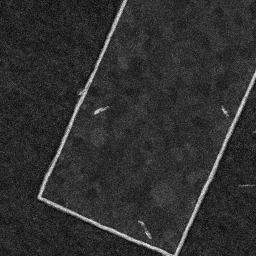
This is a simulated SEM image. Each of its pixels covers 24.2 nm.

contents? one or a few lines or trenches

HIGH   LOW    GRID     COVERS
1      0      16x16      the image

0000000011111111
0000000111111111
0000000111111111
0000001111111111
0000001111111111
0000011111111111
0000011111111110
0000011111111110
0000111111111100
0000111111111100
0001111111111000
0001111111111000
0001111111110000
0000011111110000
0000000111110000
0000000000100000